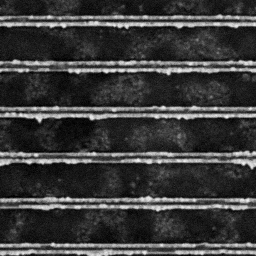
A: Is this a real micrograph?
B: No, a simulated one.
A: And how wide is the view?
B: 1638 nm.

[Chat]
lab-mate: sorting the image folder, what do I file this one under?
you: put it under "parallel lines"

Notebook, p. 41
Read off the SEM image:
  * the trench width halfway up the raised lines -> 0.228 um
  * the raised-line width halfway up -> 61.6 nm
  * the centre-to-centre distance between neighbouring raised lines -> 0.292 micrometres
